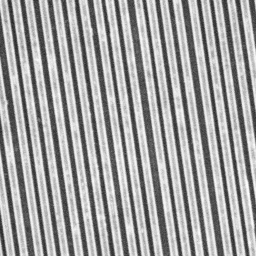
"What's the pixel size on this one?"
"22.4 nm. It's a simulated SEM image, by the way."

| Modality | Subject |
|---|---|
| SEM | parallel lines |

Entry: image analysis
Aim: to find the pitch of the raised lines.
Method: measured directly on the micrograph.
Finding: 298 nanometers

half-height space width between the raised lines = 160 nm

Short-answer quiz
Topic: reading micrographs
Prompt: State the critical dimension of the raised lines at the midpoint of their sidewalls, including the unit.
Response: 141 nm